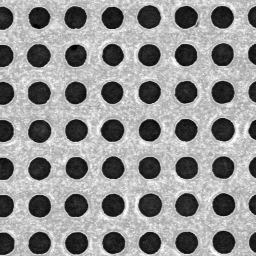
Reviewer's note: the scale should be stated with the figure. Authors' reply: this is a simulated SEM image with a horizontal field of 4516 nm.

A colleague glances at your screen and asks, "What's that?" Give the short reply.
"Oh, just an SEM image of a regular array of holes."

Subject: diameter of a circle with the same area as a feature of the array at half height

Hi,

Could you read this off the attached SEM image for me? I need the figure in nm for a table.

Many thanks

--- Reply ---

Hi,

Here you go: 406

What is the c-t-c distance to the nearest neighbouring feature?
642 nm